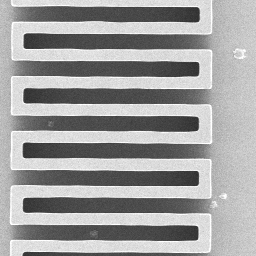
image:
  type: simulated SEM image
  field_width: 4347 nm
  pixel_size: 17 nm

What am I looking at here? groups of lines, slits or small figures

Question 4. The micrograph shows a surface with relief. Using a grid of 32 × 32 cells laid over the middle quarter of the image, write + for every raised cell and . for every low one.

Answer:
................................
................................
................................
++++++++++++++++++++++++++++++++
++++++++++++++++++++++++++++++++
++++++++++++++++++++++++++++++++
................................
................................
................................
................................
++++++++++++++++++++++++++++++++
++++++++++++++++++++++++++++++++
++++++++++++++++++++++++++++++++
................................
................................
................................
................................
++++++++++++++++++++++++++++++++
++++++++++++++++++++++++++++++++
++++++++++++++++++++++++++++++++
................................
................................
................................
................................
++++++++++++++++++++++++++++++++
++++++++++++++++++++++++++++++++
.............+++++++++++++++++++
................................
................................
................................
................................
++++++++++++++++++++++++++++++++